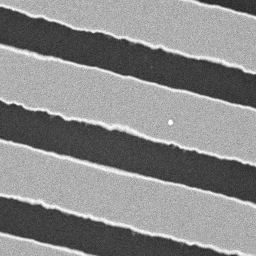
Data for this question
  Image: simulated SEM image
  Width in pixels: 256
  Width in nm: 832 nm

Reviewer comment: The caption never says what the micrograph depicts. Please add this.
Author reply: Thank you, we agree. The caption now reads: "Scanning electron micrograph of lines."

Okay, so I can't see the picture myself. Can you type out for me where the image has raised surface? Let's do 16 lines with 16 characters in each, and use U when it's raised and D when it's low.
UUUUUUUUUUUUUUDD
DDDDUUUUUUUUUUUU
DDDDDDDDUUUUUUUU
UUUDDDDDDDDUUUUU
UUUUUUUDDDDDDDDU
UUUUUUUUUUUDDDDD
DUUUUUUUUUUUUUUD
DDDDUUUUUUUUUUUU
DDDDDDDDDUUUUUUU
UUUDDDDDDDDDUUUU
UUUUUUUDDDDDDDDD
UUUUUUUUUUUDDDDD
DUUUUUUUUUUUUUUD
DDDDDUUUUUUUUUUU
DDDDDDDDDUUUUUUU
UUUUDDDDDDDDDUUU